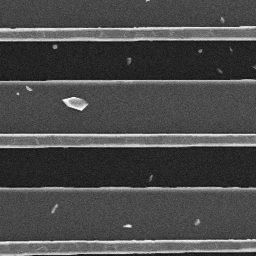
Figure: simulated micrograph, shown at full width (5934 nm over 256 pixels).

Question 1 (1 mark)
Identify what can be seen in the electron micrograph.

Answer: lines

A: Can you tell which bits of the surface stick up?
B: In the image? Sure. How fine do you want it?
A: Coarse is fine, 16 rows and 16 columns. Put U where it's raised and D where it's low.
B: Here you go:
UUUUUUUUUUUUUUUU
UUUUUUUUUUUUUUUU
UUUUDDUDDDDDDDDD
DDDDDDDDDDDDDDDD
DDDDDDDDDDDDDDDD
UUUUUUUUUUUUUUUU
UUUUUUUUUUUUUUUU
UUUUUUUUUUUUUUUU
UUUUUUUUUUUUUUUU
DDDDDDDDDDDDDDDD
DDDDDDDDDDDDDDDD
DDDDDDDDDDDDDDDD
UUUUUUUUUUUUUUUU
UUUUUUUUUUUUUUUU
UUUUUUUUUUUUUUUU
UUUUUUUUUUUUUUUU